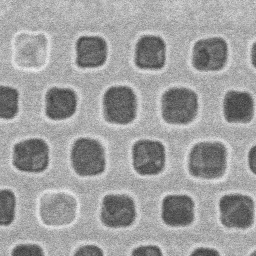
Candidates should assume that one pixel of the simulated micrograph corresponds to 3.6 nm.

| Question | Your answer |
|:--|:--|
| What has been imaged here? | a regular array of holes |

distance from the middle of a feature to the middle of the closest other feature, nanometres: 213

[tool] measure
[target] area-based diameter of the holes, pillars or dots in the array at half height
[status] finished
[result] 133 nanometres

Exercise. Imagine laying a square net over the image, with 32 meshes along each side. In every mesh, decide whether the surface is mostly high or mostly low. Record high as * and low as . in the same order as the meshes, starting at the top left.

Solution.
********************************
********************************
********************************
********************************
**********..******..************
*********....****....***....****
***.*****....****....***.....**.
*********....****....***....***.
*****************...****....****
********************************
********************************
..****...****....****...****...*
..****....***....***.....***....
..****....***....***.....***....
..****...****....***.....***....
**************..*****..*********
********************************
***..****...*****.**************
**....***....***....****....***.
**....***....***.....**.....***.
**....***....****....**.....***.
***..****....****...****....****
********************************
********************************
..***********...*****...****...*
..****.******....***....***.....
..***********....***....***.....
..***********....***....****....
**************.*************...*
********************************
***.****************************
**...****....***....****...*****